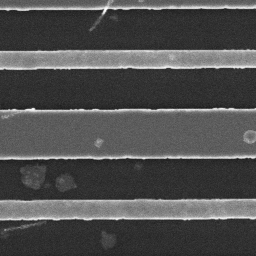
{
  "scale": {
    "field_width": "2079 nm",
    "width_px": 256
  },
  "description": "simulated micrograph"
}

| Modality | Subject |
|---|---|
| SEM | lines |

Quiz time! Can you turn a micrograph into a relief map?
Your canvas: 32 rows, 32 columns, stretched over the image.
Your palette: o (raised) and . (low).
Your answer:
oooooooooooooooooooooooooooooooo
................................
................................
................................
................................
................................
oooooooooooooooooooooooooooooooo
oooooooooooooooooooooooooooooooo
oooooooooooooooooooooooooooo.oo.
................................
................................
................................
................................
................................
oooooooooooooooooooooooooooooooo
oooooooooooooooooooooooooooooooo
oooooooooooooooooooooooooooooooo
oooooooooooooooooooooooooooooooo
oooooooooooooooooooooooooooooooo
oooooooooooooooooooooooooooooooo
................................
................................
................................
................................
................................
oooooooooooooooooooooooooooooooo
oooooooooooooooooooooooooooooooo
................................
................................
................................
................................
................................